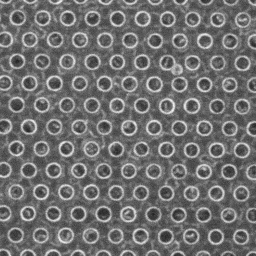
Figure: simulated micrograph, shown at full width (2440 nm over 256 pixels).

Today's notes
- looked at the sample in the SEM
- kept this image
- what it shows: a regular array of raised bodies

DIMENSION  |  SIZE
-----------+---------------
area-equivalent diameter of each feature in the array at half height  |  136 nanometres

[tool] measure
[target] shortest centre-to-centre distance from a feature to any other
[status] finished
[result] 0.235 µm